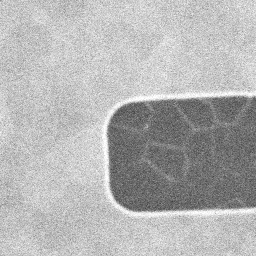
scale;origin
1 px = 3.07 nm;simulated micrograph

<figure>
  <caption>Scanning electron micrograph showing one or a few lines or trenches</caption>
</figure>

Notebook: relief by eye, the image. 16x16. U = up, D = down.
UUUUUUUUUUUUUUUU
UUUUUUUUUUUUUUUU
UUUUUUUUUUUUUUUU
UUUUUUUUUUUUUUUU
UUUUUUUUUUUUUUUU
UUUUUUUUUUUUUUUU
UUUUUUUUDDDDDDDD
UUUUUUUDDDDDDDDD
UUUUUUUDDDDDDDDD
UUUUUUUDDDDDDDDD
UUUUUUUDDDDDDDDD
UUUUUUUDDDDDDDDD
UUUUUUUDDDDDDDDD
UUUUUUUUUUUUUUUU
UUUUUUUUUUUUUUUU
UUUUUUUUUUUUUUUU